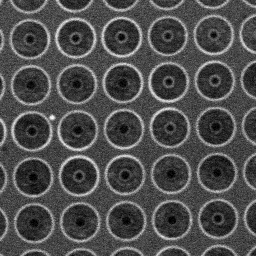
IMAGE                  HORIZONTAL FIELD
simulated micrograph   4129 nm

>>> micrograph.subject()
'an array of small figures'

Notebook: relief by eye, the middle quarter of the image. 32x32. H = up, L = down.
HHLLHHHHHHHHHLLLLHHHHHHHLLLLLHHH
LLLLLLHHHHHLLLLLLLHHHHHLLLLLLLHH
LLLLLLLHHHLLLLLLLLLHHHLLLLLLLLHH
LLLLLLLLHHLLLLHLLLLHHHLLLLHLLLLH
LLHHHLLLHHLLLHHHLLLHHLLLLHHLLLLH
LLHHHLLLHHLLLLHHLLLHHLLLLHHLLLLH
LLLLLLLLHHLLLLLLLLLHHHLLLLLLLLHH
LLLLLLLHHHHLLLLLLLLHHHLLLLLLLLHH
LLLLLLHHHHHHLLLLLLHHHHHHLLLLLHHH
HHLLLHHHHHHHHHLHHHHHHHHHHHHHHHHH
HHHHHHHHHHHHHHHHHHHHHHHHHHHHHHHH
HHHHHHHHHHHHHHLHHHHHHHHHHLLLHHHH
HLLLLLHHHHHHLLLLLLHHHHHLLLLLLLHH
LLLLLLLHHHHLLLLLLLLHHHLLLLLLLLHH
LLLLLLLLHHHLLLLLLLLHHHLLLLLLLLLH
LLLHLLLLHHLLLLHHLLLLHHLLLHHHLLLH
LLHHHLLLHHLLLLHHLLLLHHLLLHHHLLLH
LLLHLLLLHHLLLLHHLLLLHHLLLLLLLLLH
LLLLLLLLHHHLLLLLLLLHHHHLLLLLLLHH
LLLLLLLHHHHHLLLLLLHHHHHLLLLLLLHH
HLLLLLHHHHHHHLLLLHHHHHHHHLLLHHHH
HHHLHHHHHHHHHHHHHHHHHHHHHHHHHHHH
HHHHHHHHHHHHHHHHHHHHHHHHHHHHHHHH
HHLLLHHHHHHHHLLLLHHHHHHHLLLLLHHH
HLLLLLLHHHHHLLLLLLLHHHHLLLLLLLHH
LLLLLLLLHHHLLLLLLLLHHHHLLLLLLLLH
LLLLLLLLHHHLLLLLLLLLHHLLLLHHLLLH
LLLHHLLLLHLLLLHHHLLLHHLLLHHHLLLH
LLLHHLLLLHHLLLHHLLLLHHLLLLHHLLLH
LLLLLLLLHHHLLLLLLLLLHHHLLLLLLLLH
LLLLLLLLHHHHLLLLLLLHHHHLLLLLLLHH
HLLLLLLHHHHHLLLLLLHHHHHHLLLLLHHH